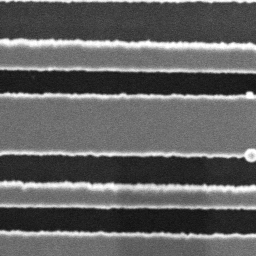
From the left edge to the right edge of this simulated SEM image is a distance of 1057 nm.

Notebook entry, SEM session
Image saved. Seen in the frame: lines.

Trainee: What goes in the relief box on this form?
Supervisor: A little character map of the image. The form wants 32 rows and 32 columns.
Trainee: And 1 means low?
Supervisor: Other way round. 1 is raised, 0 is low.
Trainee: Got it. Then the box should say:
00000000000000000000000000000000
00000000000000000000000000000000
00000000000000000000000000000000
00000000000000000000000000000000
00000000000000000000000000000000
11111111111111111111111111111111
11111111111111111111111111111111
11111111111111111111111111111111
11111111111111111111111111111111
00000000000000000000000000000000
00000000000000000000000000000000
00000000000000000000000000000000
11111111111111111111111111111111
11111111111111111111111111111111
11111111111111111111111111111111
11111111111111111111111111111111
11111111111111111111111111111111
11111111111111111111111111111111
11111111111111111111111111111111
00000000000000000000101111111111
00000000000000000000000000000000
00000000000000000000000000000000
00000000000000000000000000000000
11111111111111111111111111111111
11111111111111111111111111111111
11111111111111111111111111111111
00000000000000000000000000000000
00000000000000000000000000000000
00000000000000000000000000000000
11111111111111111111111111111111
11111111111111111111111111111111
11111111111111111111111111111111